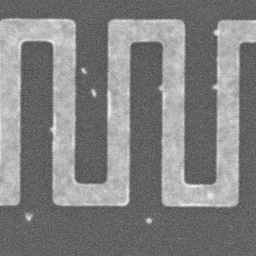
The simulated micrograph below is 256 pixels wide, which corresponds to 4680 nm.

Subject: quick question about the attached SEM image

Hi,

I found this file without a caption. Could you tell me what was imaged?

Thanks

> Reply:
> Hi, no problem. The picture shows groups of lines, slits or small figures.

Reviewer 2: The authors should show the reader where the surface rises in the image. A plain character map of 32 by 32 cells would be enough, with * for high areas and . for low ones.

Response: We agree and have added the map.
................................
................................
.*****..........................
*********.....*********....*****
*********.....*********....*****
***....**.....**....***....***..
**.....**.....**.....**....***..
**.....**.....**.....**....***..
**.....**.....**.....**....***..
**.....**.....**....***....***..
**.....**.....**....***....***..
**.....**.....**....***....***..
**.....**.....**.....**....***..
**.....**.....**.....**....***..
**.....**.....**....***....***..
**.....**.....**....***....***..
**.....**.....**....***....***..
**.....**.....**....***....***..
**.....**.....**....***....***..
**.....**.....**....***....***..
**.....**.....**....***....***..
**.....**....***....***....***..
**.....**....***....***....***..
**.....*********....**********..
**.....*********....**********..
**.....********......********...
................................
................................
................................
................................
................................
................................